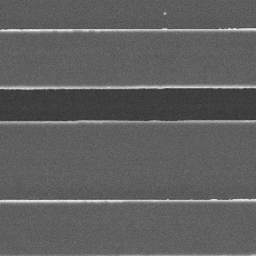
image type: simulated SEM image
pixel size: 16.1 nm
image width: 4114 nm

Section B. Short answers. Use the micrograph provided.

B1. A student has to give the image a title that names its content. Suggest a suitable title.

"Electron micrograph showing lines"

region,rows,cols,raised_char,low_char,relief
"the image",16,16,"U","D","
UUUUUUUUUUUUUUUU
UUUUUUUUUUUUUUUU
UUUUUUUUUUUUUUUU
UUUUUUUUUUUUUUUU
UUUUUUUUUUUUUUUU
UUUUUDDDDDDDDDDD
DDDDDDDDDDDDDDDD
DDDDDDDDDDDDDDDD
UUUUUUUUUUUUUUUU
UUUUUUUUUUUUUUUU
UUUUUUUUUUUUUUUU
UUUUUUUUUUUUUUUU
UUUUUUUUUUUUUUUU
UUUUUUUUUUUUUUUU
UUUUUUUUUUUUUUUU
UUUUUUUUUUUUUUUU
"